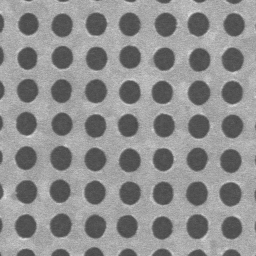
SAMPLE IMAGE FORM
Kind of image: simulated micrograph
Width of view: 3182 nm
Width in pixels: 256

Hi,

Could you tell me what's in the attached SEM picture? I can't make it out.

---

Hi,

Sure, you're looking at a regular array of holes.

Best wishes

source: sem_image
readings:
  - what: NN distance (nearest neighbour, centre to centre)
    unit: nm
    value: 409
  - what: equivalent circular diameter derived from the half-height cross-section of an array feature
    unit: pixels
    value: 23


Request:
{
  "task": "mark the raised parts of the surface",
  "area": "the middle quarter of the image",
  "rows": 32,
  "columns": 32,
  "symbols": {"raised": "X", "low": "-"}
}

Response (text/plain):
--XXXX----XXXXX---XXXXX----XXXX-
XXXXXXX--XXXXXXXXXXXXXXX--XXXXXX
XXXXXXXXXXXXXXXXXXXXXXXXXXXXXXXX
XXXXXXXXXXXXXXXXXXXXXXXXXXXXXXXX
-XXXXX----XXXXX---XXXXX---XXXXXX
--XXX------XXX-----XXX-----XXXX-
--XXX------XXX-----XXX-----XXXX-
--XXX------XXX-----XXX-----XXXX-
-XXXXX----XXXX-----XXX-----XXXX-
XXXXXXX--XXXXXX---XXXXX---XXXXXX
XXXXXXXXXXXXXXXXXXXXXXXXXXXXXXXX
XXXXXXXXXXXXXXXXXXXXXXXXXXXXXXXX
-XXXXXXXXXXXXXXXXXXXXXXX--XXXXXX
--XXXX----XXXX----XXXXX----XXXXX
--XXX-----XXX------XXX------XXX-
--XXX------XX------XXX------XXX-
--XXX-----XXXX----XXXX------XXX-
-XXXXX----XXXX----XXXXX----XXXX-
XXXXXXX-XXXXXXXXXXXXXXXXXXXXXXXX
XXXXXXXXXXXXXXXXXXXXXXXXXXXXXXXX
XXXXXXXXXXXXXXXXXXXXXXXXXXXXXXXX
--XXXX---XXXXXX---XXXXX----XXXXX
--XXX-----XXXX-----XXX-----XXXX-
--XXX------XXX-----XXX------XX--
--XXX------XXX-----XXX------XXX-
-XXXX-----XXXX-----XXX-----XXXX-
XXXXXX---XXXXXX---XXXXX---XXXXXX
XXXXXXXXXXXXXXXXXXXXXXXXXXXXXXXX
XXXXXXXXXXXXXXXXXXXXXXXXXXXXXXXX
XXXXXX---XXXXXX--XXXXXXXXXXXXXXX
-XXXX-----XXXX-----XXXX----XXXX-
--XXX------XXX-----XXX-----XXXX-